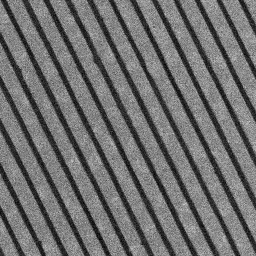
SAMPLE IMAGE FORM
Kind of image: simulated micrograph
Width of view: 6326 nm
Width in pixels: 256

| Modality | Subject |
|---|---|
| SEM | parallel lines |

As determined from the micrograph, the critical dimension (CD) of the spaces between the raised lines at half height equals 136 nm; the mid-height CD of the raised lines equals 340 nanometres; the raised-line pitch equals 477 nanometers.